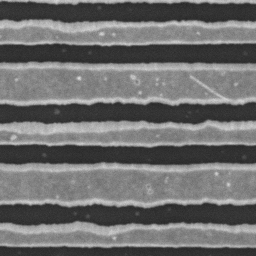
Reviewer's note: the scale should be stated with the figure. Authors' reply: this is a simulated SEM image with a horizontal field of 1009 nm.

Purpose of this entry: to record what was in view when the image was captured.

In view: lines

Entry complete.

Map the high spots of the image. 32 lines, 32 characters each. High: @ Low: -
--------------------------------
--------------------------------
--------------------------------
@@@@@@@@@@@@@@@@@@@@@@@@@@@@@@@@
@@@@@@@@@@@@@@@@@@@@@@@@@@@@@@@@
---@@----@@@@@@@@@@-------------
--------------------------------
--------------------------------
@@@@@@@@@@@@@@@@@@@@@@@@@@@@@@@@
@@@@@@@@@@@@@@@@@@@@@@@@@@@@@@@@
@@@@@@@@@@@@@@@@@@@@@@@@@@@@@@@@
@@@@@@@@@@@@@@@@@@@@@@@@@@@@@@@@
@@@@@@@@@@@@@@@@@@@@@@@@@@@@@@@@
--------------------------------
--------------------------------
-----------------@-------@@-----
@@@@@@@@@@@@@@@@@@@@@@@@@@@@@@@@
@@@@@@@@@@@@@@@@@@@@@@@@@@@@@@@@
--------------------------------
--------------------------------
--------------------------------
@@@@@@@@@@@@@@@@@@@@@@@@@@@@@@@@
@@@@@@@@@@@@@@@@@@@@@@@@@@@@@@@@
@@@@@@@@@@@@@@@@@@@@@@@@@@@@@@@@
@@@@@@@@@@@@@@@@@@@@@@@@@@@@@@@@
@--@---@@@@--@@@@@@@---@---@-@@-
--------------------------------
--------------------------------
@@---@@@@@@@---@@@@@@@@@@@@@@@@-
@@@@@@@@@@@@@@@@@@@@@@@@@@@@@@@@
@@@@@@@@@@@@@@@@@@@@@@@@@@@@@@@@
--------------------------------